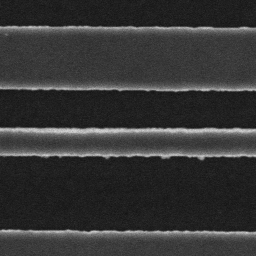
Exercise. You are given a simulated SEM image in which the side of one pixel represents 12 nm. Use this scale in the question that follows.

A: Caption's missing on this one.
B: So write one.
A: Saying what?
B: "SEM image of lines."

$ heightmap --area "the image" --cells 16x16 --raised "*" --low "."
................
................
****************
****************
****************
****************
................
................
****************
****************
................
................
................
................
*************...
****************